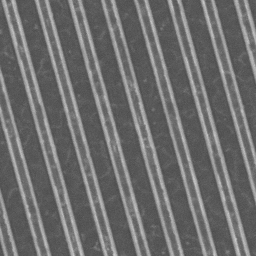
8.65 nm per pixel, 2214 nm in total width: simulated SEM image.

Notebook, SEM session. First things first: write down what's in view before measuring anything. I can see parallel lines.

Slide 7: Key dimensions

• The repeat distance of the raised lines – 32 px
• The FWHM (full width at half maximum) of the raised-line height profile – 93.9 nm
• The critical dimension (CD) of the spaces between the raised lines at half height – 180 nanometres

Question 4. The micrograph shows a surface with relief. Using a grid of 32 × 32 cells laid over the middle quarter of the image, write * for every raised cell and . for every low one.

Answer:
......***.....***.....***......*
*.....***.....***......**......*
*.....***......**......***.....*
*.....***......***.....***.....*
*......***.....***.....***......
**.....***.....***......**......
**.....***.....****.....***.....
**......**......***.....***.....
**......***.....***.....***.....
***.....***......**......***....
***.....***......***.....***....
***......**......***.....***....
.***.....***.....***......**....
.***.....***.....***......***...
.***.....***......***.....***...
..**......***.....***.....***...
..***.....***.....***......**...
..***.....***......***.....***..
..***......**......***.....***..
...**......***.....***.....***..
...***.....***......**......***.
...***.....***......***.....***.
...***......**......***.....***.
....**......***.....***......**.
....***.....***......**......***
....***.....***......***.....***
.....**......**......***.....***
.....***.....***.....***......**
.....***.....***......**......**
.....***......**......***.....**
......**......***.....***.....**
......***.....***......**......*